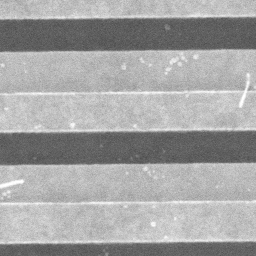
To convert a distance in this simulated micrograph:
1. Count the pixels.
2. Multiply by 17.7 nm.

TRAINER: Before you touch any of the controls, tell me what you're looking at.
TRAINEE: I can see lines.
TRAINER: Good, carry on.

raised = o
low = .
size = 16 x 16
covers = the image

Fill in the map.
oooooooooooooooo
................
................
oooooooooooooooo
oooooooooooooooo
oooooooooooooooo
oooooooooooooooo
oooooooooooooooo
................
................
oooooooooooooooo
oooooooooooooooo
oooooooooooooooo
oooooooooooooooo
oooooooooooooooo
................